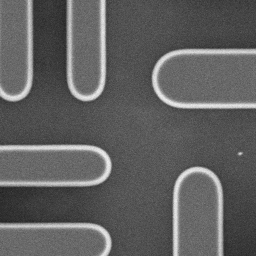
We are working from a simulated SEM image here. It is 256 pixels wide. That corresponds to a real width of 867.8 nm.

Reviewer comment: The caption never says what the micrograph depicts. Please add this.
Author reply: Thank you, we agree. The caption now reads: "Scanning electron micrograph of groups of lines, slits or small figures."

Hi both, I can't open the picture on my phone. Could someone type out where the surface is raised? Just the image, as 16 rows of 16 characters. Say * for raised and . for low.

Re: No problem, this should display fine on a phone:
**..**..........
**..**..........
**..**..........
**..**....******
**..**....******
**..**....******
...........*****
................
................
******..........
*******.........
******.....***..
...........***..
...........***..
******.....***..
*******....***..